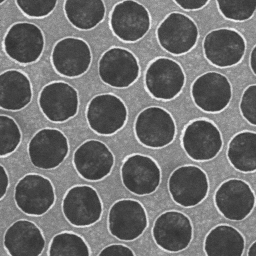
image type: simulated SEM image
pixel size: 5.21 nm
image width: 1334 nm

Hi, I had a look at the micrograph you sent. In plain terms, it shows a regular array of holes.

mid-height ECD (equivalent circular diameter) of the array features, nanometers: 210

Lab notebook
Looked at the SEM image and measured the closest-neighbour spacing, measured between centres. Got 245 nm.